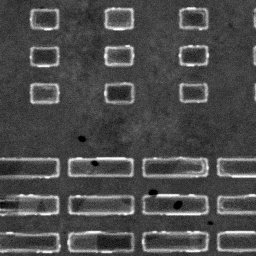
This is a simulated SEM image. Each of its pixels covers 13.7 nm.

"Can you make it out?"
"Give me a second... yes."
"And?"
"wiring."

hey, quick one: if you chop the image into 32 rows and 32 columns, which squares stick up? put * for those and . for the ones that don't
................................
....***......****......***......
....***......****......***......
................................
................................
................................
....***......***.......***......
....***......***.......***......
................................
................................
................................
....***......****......***......
....***......***.......***......
................................
................................
................................
................................
................................
................................
................................
*******..********.********.*****
*******..********.********.*****
................................
................................
................................
*******..********.********.*****
*******..*******..********..****
................................
................................
*******..*******..********.*****
*******..********.********.*****
................................